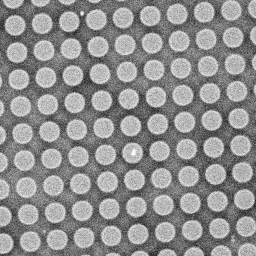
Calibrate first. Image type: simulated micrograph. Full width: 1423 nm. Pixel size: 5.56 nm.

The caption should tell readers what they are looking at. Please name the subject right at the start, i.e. an array of small figures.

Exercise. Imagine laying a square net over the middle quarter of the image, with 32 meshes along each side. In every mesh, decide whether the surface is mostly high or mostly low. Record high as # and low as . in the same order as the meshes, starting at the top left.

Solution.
........##....####..#####..####.
####...####..#####..#####..#####
#####..####..#####..#####..####.
#####..####...###....###........
.###....##......................
.............................#..
...............##....####...####
..##....###...####...####..#####
.####..#####..####...####..#####
#####..#####..####...####...###.
#####..####....###....##........
.###.....#......................
.............................##.
...............###....###...####
..###...####...####..#####..####
.####...####..#####..#####..####
.####...####...####..####....###
.####...####...###..............
..##............................
........................#....###
..........#.....###...####..####
..###...####...####...####..####
.#####..#####..####...####...###
.#####..#####..####...####....##
..####...###....##..............
................................
.......................###...###
.........###....###...####...###
..####...####..#####..#####..###
..####...####..#####..####...###
..####...####...####...###......
..####....##....................